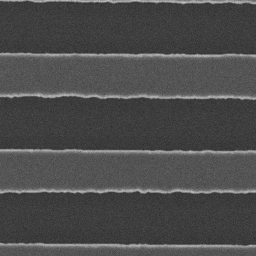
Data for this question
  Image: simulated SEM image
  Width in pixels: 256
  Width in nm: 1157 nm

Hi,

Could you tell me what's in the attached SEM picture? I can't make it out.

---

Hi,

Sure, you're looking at lines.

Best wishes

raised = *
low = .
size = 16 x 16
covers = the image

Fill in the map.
................
................
................
****************
****************
****************
................
................
................
****************
****************
****************
................
................
................
****************